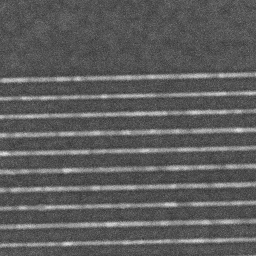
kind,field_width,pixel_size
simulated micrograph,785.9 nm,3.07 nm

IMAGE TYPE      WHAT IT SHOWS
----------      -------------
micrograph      parallel lines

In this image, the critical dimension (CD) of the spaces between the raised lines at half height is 44.9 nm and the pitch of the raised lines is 56.4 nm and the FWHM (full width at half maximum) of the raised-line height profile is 10.4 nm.